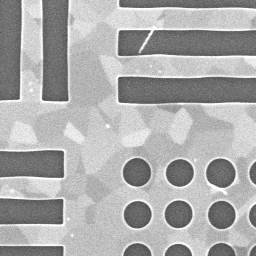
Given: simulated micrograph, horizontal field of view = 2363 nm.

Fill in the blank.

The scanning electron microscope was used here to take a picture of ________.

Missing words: groups of lines, slits or small figures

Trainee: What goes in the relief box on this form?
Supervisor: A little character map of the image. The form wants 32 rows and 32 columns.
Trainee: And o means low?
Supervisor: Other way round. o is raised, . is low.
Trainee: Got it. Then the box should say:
...oo....oooooo.................
...oo....ooooooooooooooooooooooo
...oo....ooooooooooooooooooooooo
...oo....ooooooooooooooooooooooo
...oo....oooooo.................
...oo....oooooo.................
...oo....oooooo.................
...oo....ooooooooooooooooooooooo
...oo....ooooooooooooooooooooooo
...oo....oooooo...oooooooo..oooo
...oo....oooooo.................
...oo....oooooo.................
..ooo...ooooooo.................
oooooooooooooooooooooooooooooooo
oooooooooooooooooooooooooooooooo
oooooooooooooooooooooooooooooooo
oooooooooooooooooooooooooooooooo
oooooooooooooooooooooooooooooooo
oooooooooooooooooooooooooooooooo
........oooooooooooooooooooooooo
........oooooooo...oo...oo...ooo
........ooooooo....oo...oo....o.
oooooooooooooooo...oo...oo...oo.
ooooooooooooooooooooooooooo.oooo
oooooooooooooooooooooooooooooooo
........oooooooo..ooo...ooo..ooo
........ooooooo....oo...oo....o.
........oooooooo...oo...oo...oo.
ooooooooooooooooo.oooo.oooo..ooo
oooooooooooooooooooooooooooooooo
ooooooooooooooooo.ooooooooo.oooo
........ooooooo....oo...oo...oo.